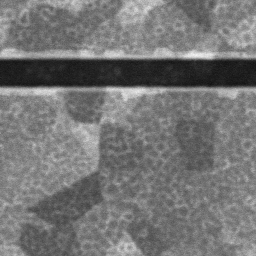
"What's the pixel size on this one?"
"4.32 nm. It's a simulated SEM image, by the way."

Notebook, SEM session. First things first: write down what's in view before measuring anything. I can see one or a few lines or trenches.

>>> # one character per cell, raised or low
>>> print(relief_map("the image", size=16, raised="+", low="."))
++++++++++++++++
++++++++++++++++
++++++++++++++++
+++++++++++.++++
................
................
++++++++++++++++
++++++++++++++++
++++++++++++++++
++++++++++++++++
++++++++++++++++
++++++++++++++++
++++++++++++++++
++++++++++++++++
++++++++++++++++
++++++++++++++++